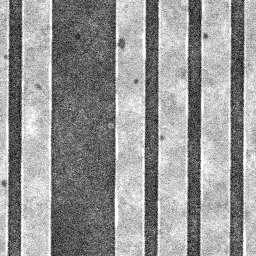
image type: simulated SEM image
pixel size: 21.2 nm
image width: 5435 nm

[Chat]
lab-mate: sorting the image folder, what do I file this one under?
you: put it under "groups of lines, slits or small figures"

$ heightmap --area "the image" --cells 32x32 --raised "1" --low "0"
10011100000000011100111001111001
10011100000000011100111001111001
10011100000000011100111001111001
10011100000000011100111001111001
10011100000000011100111001111001
10011100000000011100111001111001
10011100000000011100111001111001
10011100000000011100111001111001
10011100000000011100111001111001
10011100000000011100111001111001
10011100000000011100111001111001
10011100000000011100111001111001
10011100000000011100111001111001
10011100000000011100111001111001
10011100000000011100111001111001
10011100000000011100111001111001
10011100000000011100111001111001
10011100000000011100111001111001
10011100000000011100111001111001
10011100000000011100111001111001
10011100000000011100111001111001
10011100000000011100111001111001
10011100000000011100111001111001
10011100000000111100111001111001
10011100000000111100111001111001
10011100000000011100111001111001
10011100000000011100111001111011
10011100000000011100111001111011
10011100000000111100111001111001
10011100000000111100111001111001
10011100000000111100111001111001
10011100000000111100111001111001